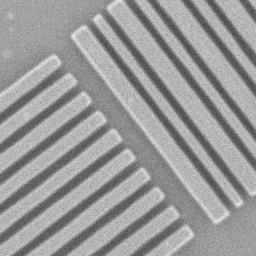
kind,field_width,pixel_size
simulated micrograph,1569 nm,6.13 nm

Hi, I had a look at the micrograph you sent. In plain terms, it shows groups of lines, slits or small figures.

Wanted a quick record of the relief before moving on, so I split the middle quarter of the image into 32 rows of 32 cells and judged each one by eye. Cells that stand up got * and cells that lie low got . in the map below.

........*****...***...*****....*
........******...**....*****...*
.........*****....**....*****...
**........*****....**...******..
***........*****...***...*****..
**..........*****...***...*****.
*...........******...**....*****
.............*****....**...*****
...***........*****...***...****
..****.........*****...***...***
******.........******...**....**
****............*****....**...**
***.....*........*****...***...*
**....****........*****...***...
.....*****........******...**...
...******..........******...**..
..******............*****....**.
.*****.....**........*****...***
*****.....****........*****...**
****....******........*****....*
**.....*****...........*****...*
*.....*****.............*****...
.....*****....***........*****..
...*****.....****........******.
..*****.....*****.........*****.
.*****....******...........*****
****.....*****.....*........****
***.....*****.....***.......****
**....******....*****........***
.....*****.....*****..........**
....*****.....*****............*
...*****....******....**.......*